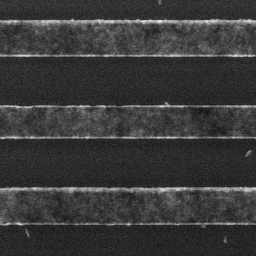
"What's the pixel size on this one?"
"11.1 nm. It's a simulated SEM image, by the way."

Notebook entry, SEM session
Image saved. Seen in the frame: lines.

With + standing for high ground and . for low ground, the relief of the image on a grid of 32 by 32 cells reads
................................
................................
................................
++++++++++++++++++++++++++++++++
++++++++++++++++++++++++++++++++
++++++++++++++++++++++++++++++++
++++++++++++++++++++++++++++++++
................................
................................
................................
................................
................................
................................
++++++++++++++++++++++++++++++++
++++++++++++++++++++++++++++++++
++++++++++++++++++++++++++++++++
++++++++++++++++++++++++++++++++
................................
................................
................................
................................
................................
................................
...++................+.++++++++.
++++++++++++++++++++++++++++++++
++++++++++++++++++++++++++++++++
++++++++++++++++++++++++++++++++
++++++++++++++++++++++++++++++++
................................
................................
................................
................................